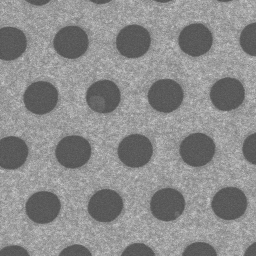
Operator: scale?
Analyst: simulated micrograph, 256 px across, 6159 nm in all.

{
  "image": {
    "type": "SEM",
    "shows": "a regular array of holes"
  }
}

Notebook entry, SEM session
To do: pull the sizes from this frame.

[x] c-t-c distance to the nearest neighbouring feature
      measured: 1490 nm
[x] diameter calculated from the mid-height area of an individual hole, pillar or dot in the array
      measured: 838 nanometres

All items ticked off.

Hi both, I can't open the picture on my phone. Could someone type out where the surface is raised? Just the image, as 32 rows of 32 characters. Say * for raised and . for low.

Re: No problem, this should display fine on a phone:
****..******.*******************
********************************
********************************
..******..*****...*****...*****.
...****....****....***.....***..
...****....***.....***.....***..
...****....****...*****...*****.
..******************************
********************************
********************************
****..******..*****...*****...**
***....****....****....***.....*
***....****....***.....***....**
***....****....****...*****...**
********************************
********************************
********************************
...*****...****....****....****.
...****....****....***.....***..
...****....****....****....***..
...*****...****...*****...******
********************************
********************************
****************************..**
****...*****...****....****....*
***.....***....****....***.....*
***....****....****....****....*
****...*****..******..******.***
********************************
********************************
****************..******..*****.
...*****...****....****....****.